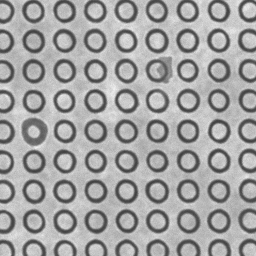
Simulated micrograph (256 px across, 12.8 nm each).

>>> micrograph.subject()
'a regular array of ring-shaped grooves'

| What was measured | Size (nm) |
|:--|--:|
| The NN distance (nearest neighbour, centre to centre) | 383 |